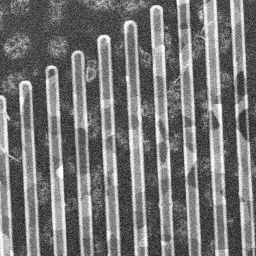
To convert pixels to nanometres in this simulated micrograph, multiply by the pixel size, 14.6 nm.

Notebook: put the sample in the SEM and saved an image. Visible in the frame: parallel lines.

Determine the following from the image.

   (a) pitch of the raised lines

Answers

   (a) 0.393 µm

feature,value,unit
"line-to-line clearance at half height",247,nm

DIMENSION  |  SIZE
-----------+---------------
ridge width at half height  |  0.15 microns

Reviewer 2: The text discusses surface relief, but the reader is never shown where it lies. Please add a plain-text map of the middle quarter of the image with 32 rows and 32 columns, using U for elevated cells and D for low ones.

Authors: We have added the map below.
DDDUUDDDDUUDDDDDUUDDDDDUUDDDDUUU
DDDUUDDDDUUDDDDDUUDDDDDUUDDDDDUU
DDDUUDUDDUUDDDDDUUDDDDDUUDDDDUUU
DDDUUDDDDUUDDDDDUUDDDDDUUDDDDUUU
DDDUUDDDDUUDDDDDUUDDDDDUUDDDDUUU
DDDUUDDDDUUDDDDDUUUDDDDUUDDDDUUU
DDDUUDDDDUUUDDDDUUUDDDDUUDDDDDUU
DDDUUDDDDUUUDDDDUUDDDDDUUDDDDDUU
DDDUUDDDDDUUDDDDUUDDDDDUUDDDDDUU
DDDUUDDDDDUUDDDDUUUDDDDUUDDDDDUU
DDDUUDDDDDUUDDDDUUUDDDDUUDDDDDUU
DDDUUDDDDDUUDDDDUUUDDDDUUDDDDDUU
DDDUUDDDDDUUDDDDUUUDDDDUUDDDDDUU
DDDUUDDDDDUUDDDDDUUDDDDUUDDDDDUU
DDDUUDDDDDUUDDDDDUUDDDDUUDDDDDUU
DDDUUDDDDDUUDDDDDUUDDDDUUUDDDDUU
DDDUUDDDDDUUDDDDDUUDDDDUUUDDDDUU
DDDUUUDDDDUUDDDDDUUDDDDDUUDDDDUU
DDDUUUDDDDUUDDDDDUUDDDDDUUDDDDUU
DDDUUUDDDDUUDDDDDUUDDDDDUUDDDDUU
DDDUUUDDDDUUDDDDDUUDDDDDUUDDDDUU
DDDUUUDDDDUUDDDDDUUDDDDDUUDDDDUU
DDDUUUDDDDUUUDDDDUUDDDDDUUDDDDDU
DDDUUUDDDDUUUDDDDUUDDDDDUUDDDDDU
DDDDUUDDDDUUUDDDDUUDDDDDUUDDDDDU
DDDDUUDDDDUUUDDDDUUDDDDDUUDDDDDU
DDDDUUDDDDUUUDDDDUUUDDDDUUDDDDDU
DDDDUUDDDDUUUDDDDUUDDDDDUUDDDDDU
DDDDUUDDDDUUUDDDDUUDDDDDUUDDDDDU
DDDDUUDDDDDUUDDDDUUDDDDDUUDDDDDU
DDDDUUDDDDDUUDDDDUUDDDDDUUDDDDDU
DDDDUUDDDDDUUDDDDUUUDDDDUUDDDDDU